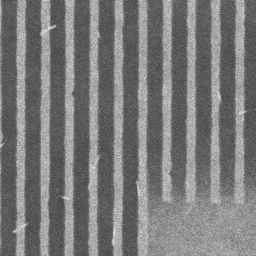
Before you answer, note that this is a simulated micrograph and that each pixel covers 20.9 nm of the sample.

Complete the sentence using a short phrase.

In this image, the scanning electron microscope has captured parallel lines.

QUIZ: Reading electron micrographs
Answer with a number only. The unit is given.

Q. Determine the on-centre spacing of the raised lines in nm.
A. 509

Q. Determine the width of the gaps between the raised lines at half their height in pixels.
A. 14.7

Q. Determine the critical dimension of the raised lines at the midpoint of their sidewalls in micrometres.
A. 0.194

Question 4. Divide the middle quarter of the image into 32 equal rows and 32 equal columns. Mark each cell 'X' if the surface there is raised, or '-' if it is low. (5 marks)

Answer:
XX-----X-----XX----XX----XX----X
XX-----XX----XX----XX----XX----X
XX----XXX----XX----XX----XX----X
XXX---XXX----XX----XX----XX----X
XX----XXX---XXX----XX----XX----X
XX----XX-----XX----XX----XX----X
XX----XX-----XX----XX----XX----X
XX----XXX----XX----XX----XX----X
XX----XXX----XX---XXX----XX----X
XX----XXX----XX---XXX----XX----X
XX----XX-----XX---XXX----XX----X
XXX---XX-----XX----XX----XX----X
XX----XX-----XX----XX----XX----X
XX----XX-----XX----XX----XX----X
XX----XXX----XX---XXX----XX----X
XX----XXX----XX---XXX----XX----X
XX----XXX----XX---XXX----XX----X
XX----XXX---XXX---XXX----XX----X
XX-----XX---XXX----XX----XX----X
XX-----XX---XXX----XX----XX----X
XX-----X----XXX----X-----XX----X
XX-----X----XXX----XX----XX----X
XX----XXX---XXX----XX----XX----X
XX----XXX---XXX---XXX----XX----X
XX----XX----XXX----X----XXX----X
XX----XX----XXX----XX----XX----X
XX----XX----XXX----XX----XX----X
XX----XX----XXX----XX----X-----X
XX----XX----XXX----XX----XX----X
XX----XX----XXX---XXX----XX----X
XX----XX----XXX---XXX----XX----X
XX----XX----XXX---XXX----XX----X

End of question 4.